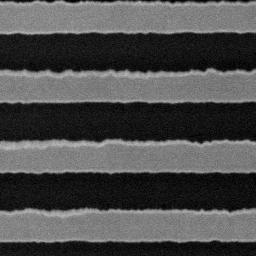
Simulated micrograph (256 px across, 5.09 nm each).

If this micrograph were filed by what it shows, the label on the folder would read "lines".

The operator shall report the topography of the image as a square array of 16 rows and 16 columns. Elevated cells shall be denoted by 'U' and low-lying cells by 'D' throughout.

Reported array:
UUUUUUUUUUUUUUUU
UUUUUUUUUUUUUUUU
DDDDDDDDDDDDDDDD
DDDDDDDDDDDDDDDD
UUUDUUUUDDUUUUUU
UUUUUUUUUUUUUUUU
DDDDDDDDDDDDDDDD
DDDDDDDDDDDDDDDD
DDDDDDDDDDDDDDDD
UUUUUUUUUUUUUUUU
UUUUUUUUUUUUUUUU
DDDDDDDDDDDDDDDD
DDDDDDDDDDDDDDDD
UUUUUUUUUUUUUUUU
UUUUUUUUUUUUUUUU
DDDDDDDDDDDDDDDD